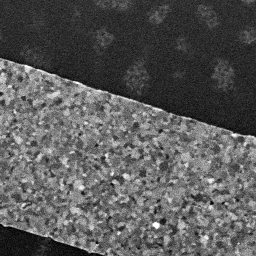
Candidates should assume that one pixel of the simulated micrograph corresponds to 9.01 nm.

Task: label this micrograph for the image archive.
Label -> one or a few lines or trenches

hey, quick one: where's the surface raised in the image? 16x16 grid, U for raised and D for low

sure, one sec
DDDDDDDDDDDDDDDD
DDDDDDDDDDDDDDDD
DDDDDDDDDDDDDDDD
DDDDDDDDDDDDDDDD
UUUDDDDDDDDDDDDD
UUUUUUDDDDDDDDDD
UUUUUUUUUDDDDDDD
UUUUUUUUUUUUDDDD
UUUUUUUUUUUUUUUD
UUUUUUUUUUUUUUUU
UUUUUUUUUUUUUUUU
UUUUUUUUUUUUUUUU
UUUUUUUUUUUUUUUU
UUUUUUUUUUUUUUUU
DDUUUUUUUUUUUUUU
DDDDDUUUUUUUUUUU